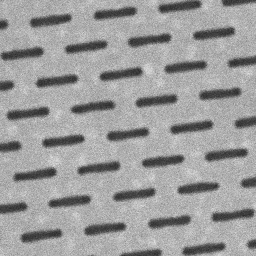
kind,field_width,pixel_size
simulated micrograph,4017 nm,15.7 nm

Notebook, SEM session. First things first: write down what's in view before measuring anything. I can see a regular array of holes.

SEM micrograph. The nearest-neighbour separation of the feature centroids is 687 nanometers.